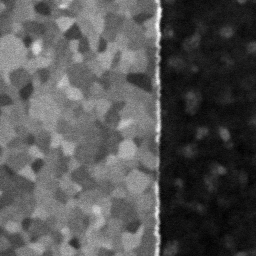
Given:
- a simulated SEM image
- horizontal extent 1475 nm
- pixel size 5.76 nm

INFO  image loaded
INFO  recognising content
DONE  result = one or a few lines or trenches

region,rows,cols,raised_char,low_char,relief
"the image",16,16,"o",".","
oooooooooo......
oooooooooo......
oooooooooo......
oooooooooo......
oooooooooo......
oooooooooo......
oooooooooo......
oooooooooo......
oooooooooo......
oooooooooo......
oooooooooo......
oooooooooo......
oooooooooo......
oooooooooo......
oooooooooo......
oooooooooo......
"